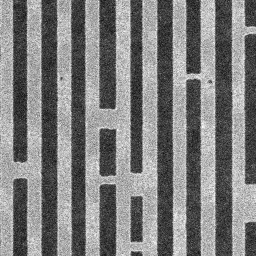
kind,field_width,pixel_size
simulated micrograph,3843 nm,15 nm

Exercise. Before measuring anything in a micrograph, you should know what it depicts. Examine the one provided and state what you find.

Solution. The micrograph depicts parallel lines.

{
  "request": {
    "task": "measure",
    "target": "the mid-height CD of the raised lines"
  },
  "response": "0.193 um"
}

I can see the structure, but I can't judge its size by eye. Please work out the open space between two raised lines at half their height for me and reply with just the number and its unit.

248 nm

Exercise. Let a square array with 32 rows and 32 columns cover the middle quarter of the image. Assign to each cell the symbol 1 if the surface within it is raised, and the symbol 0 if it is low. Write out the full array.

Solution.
11000011100001110000111000011100
11000011100001110000111000011100
11000011100001110000111000011110
11000011100001110000111000011111
11000011100001110000111000011100
11000011100001110000111000011100
11000011100001110000111000011100
11000011100001110000111000011100
11000011100001110000111000011100
11000011100001110000111000011100
11000011100001110000111000011100
11000011111111110000111000011100
11000011111111110000111000011100
11000011111111110000111000011100
11000011111111110000111000011100
11000011111111110000111000011100
11000011100001100000111000011100
11000011100001110000111000011100
11000011100001010000111000011100
11000011100001110000111000011100
11000011100001110000111000011100
11000011100001110000111000011100
11000011100001110000111000001100
11000011100001110000111000011100
11000011100001110000111000011100
11000011100001110000111000001100
11000011100001110000111000001100
11000011100001111101111000001100
11000011111111111111111000001100
11000011111111111111111000001100
11000011100001111111111000001100
11000011100001111111111000001100